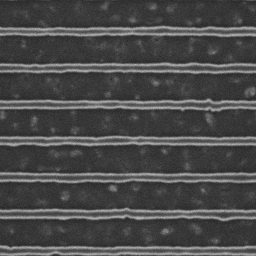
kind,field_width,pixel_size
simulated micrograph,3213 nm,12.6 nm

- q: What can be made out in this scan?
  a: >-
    parallel lines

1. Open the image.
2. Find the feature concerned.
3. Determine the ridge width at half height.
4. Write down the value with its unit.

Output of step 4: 0.0863 microns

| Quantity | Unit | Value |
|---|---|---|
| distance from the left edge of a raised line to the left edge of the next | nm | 459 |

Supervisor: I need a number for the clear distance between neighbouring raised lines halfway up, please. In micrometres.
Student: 0.377